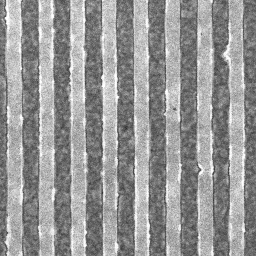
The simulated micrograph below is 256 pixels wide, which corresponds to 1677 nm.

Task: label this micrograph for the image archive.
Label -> parallel lines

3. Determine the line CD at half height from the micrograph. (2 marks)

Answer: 13.8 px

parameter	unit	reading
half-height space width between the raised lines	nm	113